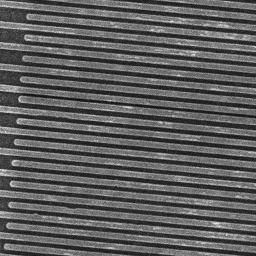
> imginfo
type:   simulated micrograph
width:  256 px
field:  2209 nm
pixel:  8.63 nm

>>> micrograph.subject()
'parallel lines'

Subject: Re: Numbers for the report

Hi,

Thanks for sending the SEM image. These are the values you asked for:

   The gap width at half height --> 37.5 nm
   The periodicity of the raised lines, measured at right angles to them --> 90.6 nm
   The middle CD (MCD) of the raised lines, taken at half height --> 52.6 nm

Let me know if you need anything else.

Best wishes